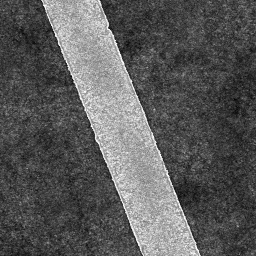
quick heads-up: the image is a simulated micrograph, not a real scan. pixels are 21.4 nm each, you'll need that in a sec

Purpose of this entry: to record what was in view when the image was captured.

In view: one or a few lines or trenches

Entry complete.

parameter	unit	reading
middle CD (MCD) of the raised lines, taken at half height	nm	1140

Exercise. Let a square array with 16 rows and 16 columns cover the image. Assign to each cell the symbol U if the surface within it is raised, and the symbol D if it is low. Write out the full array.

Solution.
DDDUUUDDDDDDDDDD
DDDUUUUDDDDDDDDD
DDDDUUUDDDDDDDDD
DDDDUUUUDDDDDDDD
DDDDUUUUDDDDDDDD
DDDDDUUUDDDDDDDD
DDDDDUUUUDDDDDDD
DDDDDDUUUDDDDDDD
DDDDDDUUUUDDDDDD
DDDDDDUUUUDDDDDD
DDDDDDDUUUDDDDDD
DDDDDDDUUUUDDDDD
DDDDDDDDUUUDDDDD
DDDDDDDDUUUUDDDD
DDDDDDDDUUUUDDDD
DDDDDDDDDUUUDDDD